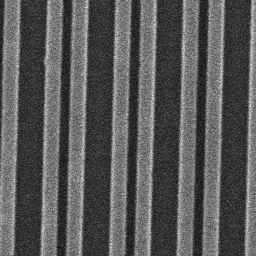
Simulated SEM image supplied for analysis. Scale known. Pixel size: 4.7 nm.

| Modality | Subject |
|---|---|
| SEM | parallel lines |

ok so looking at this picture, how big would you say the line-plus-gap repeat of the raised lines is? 158 nm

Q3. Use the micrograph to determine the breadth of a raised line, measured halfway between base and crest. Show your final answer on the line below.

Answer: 66.4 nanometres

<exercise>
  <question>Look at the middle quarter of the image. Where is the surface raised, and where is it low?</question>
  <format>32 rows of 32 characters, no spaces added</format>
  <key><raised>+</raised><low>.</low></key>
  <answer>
..+++........+++...+++........++
..+++........+++...+++........++
..+++........+++...+++........++
..+++........+++...+++........++
..+++........+++...+++........++
..+++........+++...+++........++
..+++........+++...+++........++
..+++........+++...+++........++
..+++........+++...+++........++
..+++........+++...+++.......+++
..+++........+++...+++.......+++
..+++.......++++...+++.......+++
..+++.......++++...+++.......+++
..+++.......++++...+++.......+++
..+++.......++++...+++.......+++
..+++.......++++...+++.......+++
..+++.......++++...+++.......+++
..+++.......++++...+++.......+++
.++++.......++++...+++.......+++
.++++.......++++...+++.......+++
.++++.......++++...+++.......+++
.++++.......++++...+++.......+++
.++++.......++++...+++.......+++
.++++.......+++....+++.......+++
.++++.......+++....+++.......+++
.++++.......+++...++++.......+++
.++++.......+++...++++.......+++
.++++.......+++...+++........+++
.++++.......+++...++++.......+++
.++++.......+++...++++.......+++
.++++.......+++...++++.......+++
.+++........+++...++++.......+++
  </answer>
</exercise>